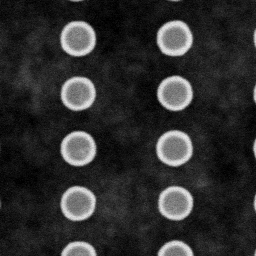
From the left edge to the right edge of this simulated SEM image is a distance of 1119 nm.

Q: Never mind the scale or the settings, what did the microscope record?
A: a regular array of raised bodies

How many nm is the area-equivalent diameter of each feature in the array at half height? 142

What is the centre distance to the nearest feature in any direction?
241 nanometers